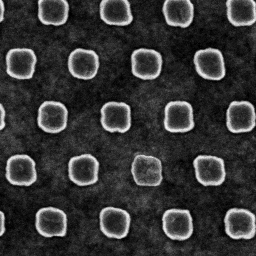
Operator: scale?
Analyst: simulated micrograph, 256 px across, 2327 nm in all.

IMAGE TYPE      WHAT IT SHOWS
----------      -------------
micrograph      a regular array of raised bodies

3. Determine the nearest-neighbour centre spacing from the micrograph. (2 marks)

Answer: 61.2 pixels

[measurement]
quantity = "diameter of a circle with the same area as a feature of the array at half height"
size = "268 nanometers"